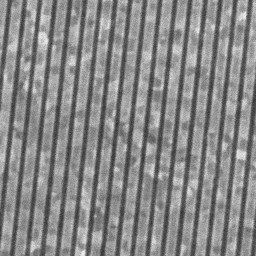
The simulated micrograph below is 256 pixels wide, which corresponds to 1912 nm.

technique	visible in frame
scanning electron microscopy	parallel lines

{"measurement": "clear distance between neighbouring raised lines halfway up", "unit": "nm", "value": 43.6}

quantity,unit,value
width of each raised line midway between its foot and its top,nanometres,67.8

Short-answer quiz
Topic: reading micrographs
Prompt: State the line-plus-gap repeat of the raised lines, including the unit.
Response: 15 px